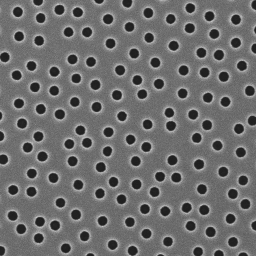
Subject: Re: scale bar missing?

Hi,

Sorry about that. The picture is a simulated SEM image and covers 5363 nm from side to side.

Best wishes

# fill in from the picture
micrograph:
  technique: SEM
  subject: a regular array of holes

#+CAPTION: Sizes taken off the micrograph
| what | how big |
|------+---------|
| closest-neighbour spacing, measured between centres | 19.4 pixels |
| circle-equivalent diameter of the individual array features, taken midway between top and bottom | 10.1 px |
